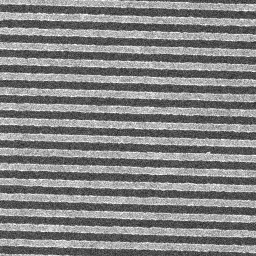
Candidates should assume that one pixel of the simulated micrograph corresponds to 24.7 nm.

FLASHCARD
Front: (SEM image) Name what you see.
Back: parallel lines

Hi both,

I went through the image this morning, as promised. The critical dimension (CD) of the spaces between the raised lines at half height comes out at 213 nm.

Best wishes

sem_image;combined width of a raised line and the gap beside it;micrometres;0.373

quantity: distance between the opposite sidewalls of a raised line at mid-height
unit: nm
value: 158